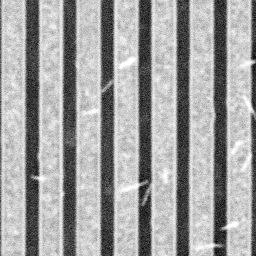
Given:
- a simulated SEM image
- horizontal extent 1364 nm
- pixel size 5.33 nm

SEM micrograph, parallel lines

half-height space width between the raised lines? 83.9 nanometers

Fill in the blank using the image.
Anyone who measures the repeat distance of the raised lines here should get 201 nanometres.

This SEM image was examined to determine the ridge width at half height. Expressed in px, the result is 22.1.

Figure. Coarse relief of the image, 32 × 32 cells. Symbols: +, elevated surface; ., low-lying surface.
+++..+++..++..+++..+++..+++..++.
+++..+++..++..+++..+++..++...++.
+++..+++..++..+++..+++..++...++.
+++..+++..++..+++..+++..+++..++.
+++..+++..++..+++..+++..+++..++.
+++..+++..++..+++..+++..+++..++.
+++..+++..++..+++..+++..+++..++.
+++..+++..++..+++..+++..+++..++.
+++..+++..++..+++..+++..+++..++.
+++..+++..++..+++..+++..+++..++.
+++..+++..++..+++..+++..+++..++.
+++..+++..++..+++..+++..++...++.
+++..+++..++..+++..+++..++...++.
+++..+++..++..+++..+++..+++..++.
+++..+++..++..+++..+++..+++..++.
+++..+++..++..+++..+++..+++..++.
+++..+++..++..+++..+++..+++..++.
+++..+++..++..+++..+++..+++..++.
+++..+++..++..+++..+++..+++..++.
+++..+++..++..+++..+++..+++..++.
+++..+++..++..+++..+++..+++..++.
+++..+++..++..+++..+++..+++..++.
+++..+++..++..+++..+++..++...++.
+++..+++..++..+++..+++..+++..++.
+++..+++..++..+++..+++..+++..++.
+++..+++..++..+++..+++..+++..++.
+++..+++..++...++..+++..+++..++.
+++..+++..++...++..+++..+++..++.
+++..+++..++...++..+++..++..+++.
+++..+++..++...++..+++..++...++.
+++..+++..++..+++..+++..+++..++.
+++..+++..++..+++..+++..+++..++.